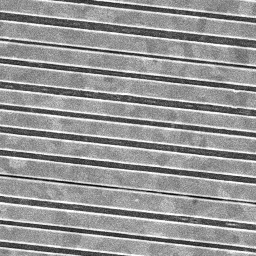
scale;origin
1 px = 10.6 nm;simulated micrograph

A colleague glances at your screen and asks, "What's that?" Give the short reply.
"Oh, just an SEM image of parallel lines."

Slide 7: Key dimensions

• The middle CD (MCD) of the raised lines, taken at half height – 170 nm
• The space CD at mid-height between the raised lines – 0.0694 micrometres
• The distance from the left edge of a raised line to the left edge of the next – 241 nm